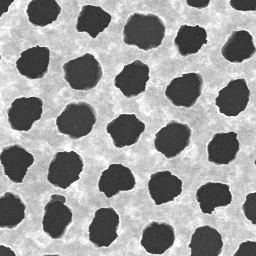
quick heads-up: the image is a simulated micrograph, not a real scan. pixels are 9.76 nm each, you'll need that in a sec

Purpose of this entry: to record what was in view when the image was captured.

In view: a regular array of holes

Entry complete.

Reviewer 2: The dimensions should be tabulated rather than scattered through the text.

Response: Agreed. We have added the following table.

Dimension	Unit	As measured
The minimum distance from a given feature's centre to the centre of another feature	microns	0.473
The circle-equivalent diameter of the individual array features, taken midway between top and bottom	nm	326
